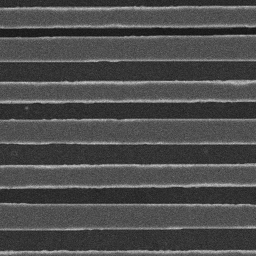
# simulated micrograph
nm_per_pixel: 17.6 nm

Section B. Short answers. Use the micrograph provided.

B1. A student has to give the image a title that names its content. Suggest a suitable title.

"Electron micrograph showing lines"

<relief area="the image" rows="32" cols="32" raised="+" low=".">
................................
++++++++++++++++++++++++++++++++
++++++++++++++++++++++++++++++++
................................
..........................++++++
++++++++++++++++++++++++++++++++
++++++++++++++++++++++++++++++++
++++++++++++++++++++++++++++++++
................................
................................
++++++++++++++++++++++++++++++++
++++++++++++++++++++++++++++++++
++++++++++++++++++++++++++++++++
................................
................................
++++++++++++++++++++++++++++++++
++++++++++++++++++++++++++++++++
++++++++++++++++++++++++++++++++
................................
................................
................................
++++++++++++++++++++++++++++++++
++++++++++++++++++++++++++++++++
+++++++.....+...................
................................
++++............................
++++++++++++++++++++++++++++++++
++++++++++++++++++++++++++++++++
+++++++++++++++++++++++.........
................................
................................
++++++++++++++++++++++++++++++++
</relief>